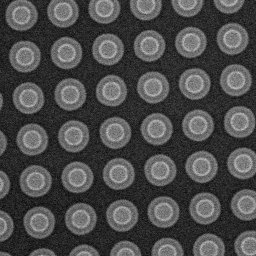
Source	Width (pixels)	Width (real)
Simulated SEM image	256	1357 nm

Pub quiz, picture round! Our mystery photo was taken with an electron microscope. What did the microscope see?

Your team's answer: an array of small figures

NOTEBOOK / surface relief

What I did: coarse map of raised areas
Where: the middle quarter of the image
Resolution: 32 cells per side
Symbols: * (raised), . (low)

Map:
***.............................
...............................*
....................****......**
..........****.....******....***
****.....******....*******...***
*****...*******...********...***
*****...********..********...***
*****...********...*******....**
*****...*******....******......*
*****....******......***........
****............................
................................
......................**.......*
............**......******....**
.***......******....*******...**
*****....*******...********...**
******...********..********...**
******...********..********...**
******...*******....******.....*
******....******.....****.......
*****......****.................
.***............................
................................
......................****.....*
...........*****.....******....*
.*****....*******...********..**
*******...*******...********..**
*******...*******...********...*
*******...********...*******....
*******...*******....******.....
*******....*****................
.*****..........................